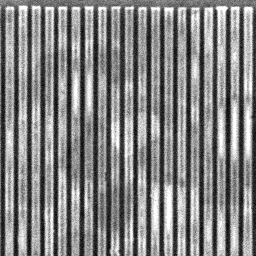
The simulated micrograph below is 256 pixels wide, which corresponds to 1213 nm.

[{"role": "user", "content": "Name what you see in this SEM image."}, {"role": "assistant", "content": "parallel lines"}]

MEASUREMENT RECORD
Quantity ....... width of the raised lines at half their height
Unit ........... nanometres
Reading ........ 37.9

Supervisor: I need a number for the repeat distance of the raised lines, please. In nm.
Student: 62.8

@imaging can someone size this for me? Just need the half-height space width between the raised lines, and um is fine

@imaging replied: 0.0255